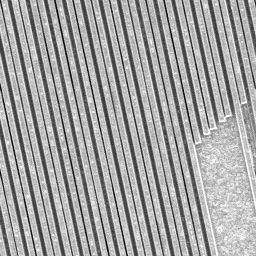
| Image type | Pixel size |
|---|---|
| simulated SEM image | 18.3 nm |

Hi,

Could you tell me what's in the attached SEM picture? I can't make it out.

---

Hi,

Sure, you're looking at parallel lines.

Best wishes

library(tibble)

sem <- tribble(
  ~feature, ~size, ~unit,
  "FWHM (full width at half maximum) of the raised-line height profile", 101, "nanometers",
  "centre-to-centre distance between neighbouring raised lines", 163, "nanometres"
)